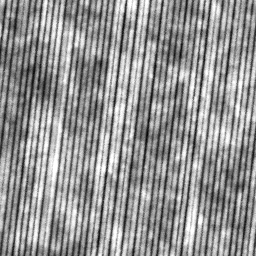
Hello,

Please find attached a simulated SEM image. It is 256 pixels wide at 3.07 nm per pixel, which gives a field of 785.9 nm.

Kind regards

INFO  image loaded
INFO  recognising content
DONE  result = parallel lines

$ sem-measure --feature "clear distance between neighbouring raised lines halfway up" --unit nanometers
5.3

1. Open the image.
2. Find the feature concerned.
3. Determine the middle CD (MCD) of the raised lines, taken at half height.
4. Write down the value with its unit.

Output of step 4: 13.3 nm